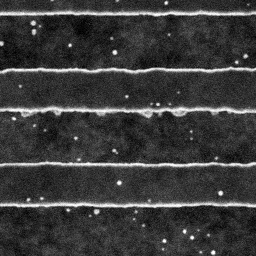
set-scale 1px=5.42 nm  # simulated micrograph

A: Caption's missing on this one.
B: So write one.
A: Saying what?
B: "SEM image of lines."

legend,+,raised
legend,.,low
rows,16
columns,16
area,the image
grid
++++++++++++++++
................
................
................
++++++++++++++++
++++++++++++++++
++++++++++++++++
................
................
................
++++++++++++++++
++++++++++++++++
++++++++++++++++
................
................
................